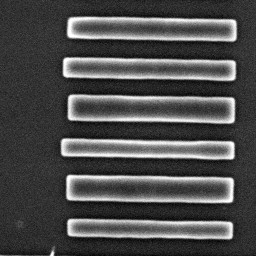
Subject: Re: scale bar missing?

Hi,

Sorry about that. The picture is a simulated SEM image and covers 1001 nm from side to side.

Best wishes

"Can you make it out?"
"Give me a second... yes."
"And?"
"groups of lines, slits or small figures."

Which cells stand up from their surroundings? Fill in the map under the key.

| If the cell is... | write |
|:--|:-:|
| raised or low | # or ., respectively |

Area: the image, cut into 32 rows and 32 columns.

................................
................................
.........##############.........
.........####################...
.........####################...
................................
................................
........##############..........
........#####################...
........#####################...
................................
................................
.........####################...
.........####################...
.........####################...
................................
................................
........####....................
........#####################...
...............##############...
................................
................................
.........####################...
........#####################...
........#####################...
................................
................................
.........##.....................
.........####################...
.............################...
................................
................................